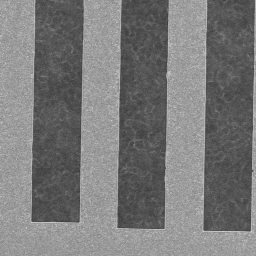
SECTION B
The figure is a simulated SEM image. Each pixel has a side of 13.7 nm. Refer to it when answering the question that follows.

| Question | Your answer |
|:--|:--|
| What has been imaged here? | one or a few lines or trenches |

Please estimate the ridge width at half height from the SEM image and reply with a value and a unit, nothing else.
0.513 µm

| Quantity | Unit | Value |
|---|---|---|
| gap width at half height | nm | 661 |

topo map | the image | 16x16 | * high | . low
**...***...**...
**...***...**...
**...**....**...
**...**....**...
**...**...***...
**...**...***...
**...**...***...
**...**...***...
**...**...***...
**...**...***...
**...**...***...
**...**...***...
**...**...***...
**...**...***...
**************.*
****************